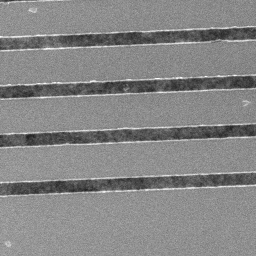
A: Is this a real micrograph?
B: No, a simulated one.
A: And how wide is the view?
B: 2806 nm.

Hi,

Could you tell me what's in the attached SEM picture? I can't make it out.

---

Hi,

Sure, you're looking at parallel lines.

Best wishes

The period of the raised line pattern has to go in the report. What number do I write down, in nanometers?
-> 530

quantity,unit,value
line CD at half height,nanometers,146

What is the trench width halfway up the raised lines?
383 nm